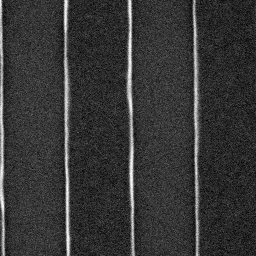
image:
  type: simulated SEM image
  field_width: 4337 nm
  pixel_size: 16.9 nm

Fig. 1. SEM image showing wiring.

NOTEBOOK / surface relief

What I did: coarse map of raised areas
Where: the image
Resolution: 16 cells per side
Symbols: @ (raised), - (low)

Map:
----@@@@----@@@@
----@@@@----@@@@
----@@@@----@@@@
----@@@@----@@@@
----@@@@----@@@@
----@@@@----@@@@
----@@@@----@@@@
----@@@@----@@@@
----@@@@----@@@@
----@@@@----@@@@
----@@@@----@@@@
----@@@@----@@@@
----@@@@----@@@@
----@@@@----@@@@
----@@@@----@@@@
----@@@@----@@@@